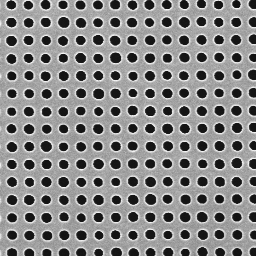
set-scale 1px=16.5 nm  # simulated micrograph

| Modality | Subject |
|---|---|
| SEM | a regular array of holes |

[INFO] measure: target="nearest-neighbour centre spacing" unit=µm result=0.281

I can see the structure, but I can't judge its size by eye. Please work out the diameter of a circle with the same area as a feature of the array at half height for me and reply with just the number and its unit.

163 nm